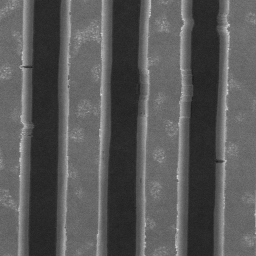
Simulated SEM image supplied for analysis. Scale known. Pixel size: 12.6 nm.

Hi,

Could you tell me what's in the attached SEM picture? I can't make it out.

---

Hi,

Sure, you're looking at one or a few lines or trenches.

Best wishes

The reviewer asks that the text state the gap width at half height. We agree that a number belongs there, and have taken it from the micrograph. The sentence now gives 36.1 px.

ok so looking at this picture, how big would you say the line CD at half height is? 535 nm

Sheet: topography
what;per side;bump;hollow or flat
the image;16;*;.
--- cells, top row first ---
**..***..***..**
**..***..***..**
**..***..***..**
**..***..***..**
**..***..***..**
**..***..***..**
**..***..***..**
**..***..***..**
**..***..***..**
**..**...***..**
**..**...**...**
**..**...**...**
*...**...**...**
*...**...**...**
*...**...**...**
*...**...**...**